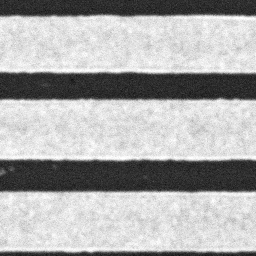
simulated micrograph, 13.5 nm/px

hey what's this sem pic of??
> lines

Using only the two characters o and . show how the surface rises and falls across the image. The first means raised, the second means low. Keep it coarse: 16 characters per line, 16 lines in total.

................
oooooooooooooooo
oooooooooooooooo
oooooooooooooooo
................
................
oooooooooooooooo
oooooooooooooooo
oooooooooooooooo
oooooooooooooooo
................
................
oooooooooooooooo
oooooooooooooooo
oooooooooooooooo
oooooooooooooooo